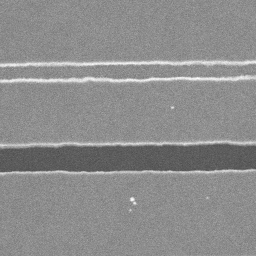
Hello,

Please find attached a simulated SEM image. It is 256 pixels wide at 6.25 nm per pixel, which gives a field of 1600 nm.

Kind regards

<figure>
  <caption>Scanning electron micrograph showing lines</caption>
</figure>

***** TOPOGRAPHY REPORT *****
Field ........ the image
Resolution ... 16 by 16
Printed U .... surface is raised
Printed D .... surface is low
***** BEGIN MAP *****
UUUUUUUUUUUUUUUU
UUUUUUUUUUUUUUUU
UUUUUUUUUUUUUUUU
UUUUUUUUUUUUUUUU
UUUUUUUUUUUUUUUU
UUUUUUUUUUUUUUUU
UUUUUUUUUUUUUUUU
UUUUUUUUUUUUUUUU
UUUUUUUUUUUUUUUU
DDDDDDDDDDDDDDDD
DDDDDDDDDDDDDDDD
UUUUUUUUUUUUUUUU
UUUUUUUUUUUUUUUU
UUUUUUUUUUUUUUUU
UUUUUUUUUUUUUUUU
UUUUUUUUUUUUUUUU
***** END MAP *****